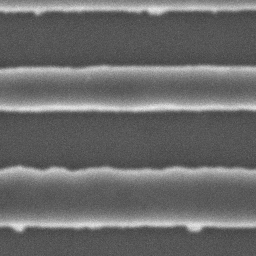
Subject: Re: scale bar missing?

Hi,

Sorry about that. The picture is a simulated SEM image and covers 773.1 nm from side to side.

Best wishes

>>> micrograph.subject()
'lines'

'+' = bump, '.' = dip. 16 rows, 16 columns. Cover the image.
++++++++++++++++
................
................
................
++++++++++++++++
++++++++++++++++
++++++++++++++++
................
................
................
.+....+......+..
++++++++++++++++
++++++++++++++++
++++++++++++++++
................
................